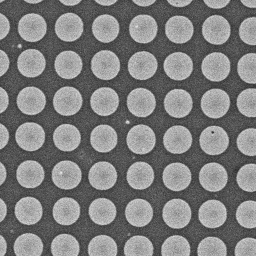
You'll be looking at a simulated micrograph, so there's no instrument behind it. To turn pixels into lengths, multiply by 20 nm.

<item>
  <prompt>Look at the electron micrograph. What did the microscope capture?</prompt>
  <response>an array of small figures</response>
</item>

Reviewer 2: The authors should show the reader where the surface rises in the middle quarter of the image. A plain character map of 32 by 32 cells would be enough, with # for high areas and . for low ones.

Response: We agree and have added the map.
####...#######..#######..#######
####...#######..#######..#######
####....#####....#####....######
##.......###......###......###..
................................
................................
###.....####.....####......###..
####...######...######....#####.
####...#######..#######..#######
####...#######..#######..#######
####...######...#######..#######
####...######...######...#######
##.......###.....#####....#####.
................................
................................
##.......##.......###...........
###....######....#####....#####.
####...######...#######..#######
####...######...#######..#######
####...######...#######..#######
###....######...######...#######
##......####.....#####....#####.
................................
................................
##.................#............
###....#####.....#####....####..
####..#######...######...######.
####..#######...######...#######
####..#######...######...#######
####..#######...######...######.
###....#####.....####.....#####.
...........................##...